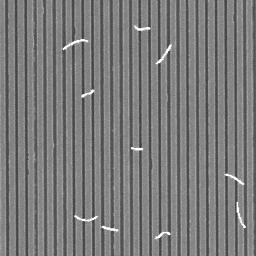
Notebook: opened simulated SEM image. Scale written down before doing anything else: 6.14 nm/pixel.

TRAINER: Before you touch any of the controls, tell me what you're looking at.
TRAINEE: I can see parallel lines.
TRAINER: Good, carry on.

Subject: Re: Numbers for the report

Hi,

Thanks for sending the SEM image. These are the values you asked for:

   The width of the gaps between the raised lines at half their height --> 18.4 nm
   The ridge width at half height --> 36.1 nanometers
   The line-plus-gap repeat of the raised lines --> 58.4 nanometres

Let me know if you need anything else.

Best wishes